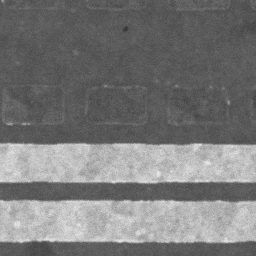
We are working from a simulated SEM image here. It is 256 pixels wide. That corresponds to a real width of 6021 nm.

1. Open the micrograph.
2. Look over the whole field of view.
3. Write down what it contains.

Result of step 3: wiring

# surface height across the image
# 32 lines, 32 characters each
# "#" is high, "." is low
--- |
.#######...#######...########..#
................................
................................
................................
................................
................................
................................
................................
................................
................................
................................
########...#######...#######...#
########...#######...#######...#
########...#######...#######...#
########...#######...#######...#
................##....#.........
................................
................................
################################
################################
################################
################################
################################
................................
................................
################################
################################
################################
################################
################################
................................
................................